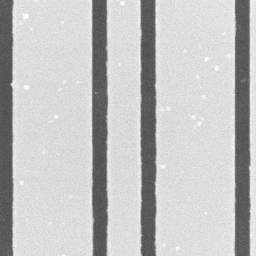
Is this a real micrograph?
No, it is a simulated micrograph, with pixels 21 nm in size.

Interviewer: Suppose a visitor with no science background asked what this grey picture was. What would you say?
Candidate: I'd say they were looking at lines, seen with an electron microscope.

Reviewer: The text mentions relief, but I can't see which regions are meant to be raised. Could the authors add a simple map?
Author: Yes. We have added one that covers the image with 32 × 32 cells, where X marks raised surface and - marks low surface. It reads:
--XXXXXXXXX--XXXX---XXXXXXXXX--X
--XXXXXXXXX--XXXX---XXXXXXXXX--X
--XXXXXXXXX--XXXX---XXXXXXXXX--X
--XXXXXXXXX--XXXXX--XXXXXXXXX--X
--XXXXXXXXX--XXXXX--XXXXXXXXX--X
--XXXXXXXXX--XXXX---XXXXXXXXX--X
--XXXXXXXXX--XXXX---XXXXXXXXX--X
--XXXXXXXXX---XXX---XXXXXXXXX--X
--XXXXXXXXX--XXXXX--XXXXXXXXX--X
--XXXXXXXXX--XXXX---XXXXXXXXX--X
--XXXXXXXXX---XXX---XXXXXXXXX--X
--XXXXXXXXX--XXXXX--XXXXXXXXX--X
--XXXXXXXXX---XXXX--XXXXXXXXX--X
--XXXXXXXXX---XXX---XXXXXXXXX--X
--XXXXXXXXX--XXXX---XXXXXXXXX--X
--XXXXXXXXX--XXXX---XXXXXXXXX--X
--XXXXXXXXX---XXX---XXXXXXXXX--X
--XXXXXXXXX--XXXX---XXXXXXXXX--X
--XXXXXXXXX--XXXX---XXXXXXXXX--X
--XXXXXXXXX--XXXX---XXXXXXXXX--X
--XXXXXXXXX--XXXXX--XXXXXXXXX--X
--XXXXXXXXX--XXXXX--XXXXXXXXX--X
--XXXXXXXXX--XXXXX--XXXXXXXXX--X
--XXXXXXXXX--XXXXX--XXXXXXXXX--X
--XXXXXXXXX--XXXXX--XXXXXXXXX--X
--XXXXXXXXX---XXXX--XXXXXXXXX--X
--XXXXXXXXX---XXXX--XXXXXXXXX--X
--XXXXXXXXXX--XXX---XXXXXXXXX--X
--XXXXXXXXXX-XXXXX--XXXXXXXXX--X
--XXXXXXXXXX-XXXXX--XXXXXXXXX--X
--XXXXXXXXXX-XXXXX--XXXXXXXXX--X
--XXXXXXXXXX-XXXXX--XXXXXXXXX--X